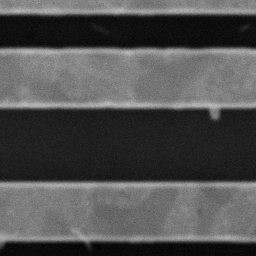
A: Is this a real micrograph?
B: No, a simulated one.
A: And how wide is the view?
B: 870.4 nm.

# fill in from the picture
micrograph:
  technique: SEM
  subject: lines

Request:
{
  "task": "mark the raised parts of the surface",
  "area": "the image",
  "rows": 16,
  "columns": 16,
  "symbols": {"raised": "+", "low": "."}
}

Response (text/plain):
++++++++++++++++
................
................
++++++++++++++++
++++++++++++++++
++++++++++++++++
++++++++++++++++
................
................
................
................
++++++++++++++++
++++++++++++++++
++++++++++++++++
++++++++++++++++
................